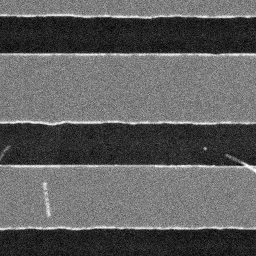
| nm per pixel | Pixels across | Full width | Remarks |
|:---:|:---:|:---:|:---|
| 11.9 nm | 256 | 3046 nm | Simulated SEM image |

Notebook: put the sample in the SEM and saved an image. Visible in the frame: lines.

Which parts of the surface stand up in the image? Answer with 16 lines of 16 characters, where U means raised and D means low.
UUUUUUUUUUUUUUUU
DDDDDDDDDDDDDDDD
DDDDDDDDDDDDDDDD
UUUUUUUUUUUUUUUU
UUUUUUUUUUUUUUUU
UUUUUUUUUUUUUUUU
UUUUUUUUUUUUUUUU
UUUUUUUUUUUUUUUU
DDDDDDDDDDDDDDDD
DDDDDDDDDDDDDDDD
UUUUUUUUUUUUUUUU
UUUUUUUUUUUUUUUU
UUUUUUUUUUUUUUUU
UUUUUUUUUUUUUUUU
DDDDDDDDDDDDDDDD
DDDDDDDDDDDDDDDD